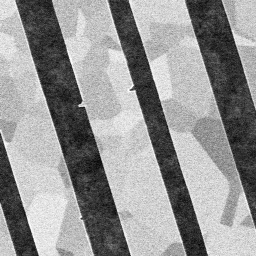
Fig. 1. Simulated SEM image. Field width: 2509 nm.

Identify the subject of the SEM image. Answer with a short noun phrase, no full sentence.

one or a few lines or trenches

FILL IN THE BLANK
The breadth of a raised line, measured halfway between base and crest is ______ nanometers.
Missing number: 511